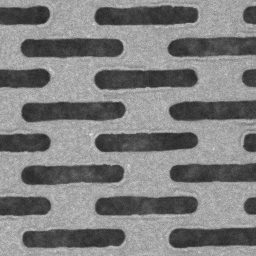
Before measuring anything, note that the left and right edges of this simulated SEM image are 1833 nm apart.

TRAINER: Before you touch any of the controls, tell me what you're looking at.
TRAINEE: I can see a regular array of holes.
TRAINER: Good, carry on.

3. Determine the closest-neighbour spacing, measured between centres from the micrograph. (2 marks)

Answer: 453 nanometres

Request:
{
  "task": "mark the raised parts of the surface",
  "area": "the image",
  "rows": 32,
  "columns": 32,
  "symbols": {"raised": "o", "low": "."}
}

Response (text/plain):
oooooooooooooooooooooooooooooooo
......oooooo.............ooooo..
......oooooo.............oooooo.
oooooooooooooooooooooooooooooooo
oooooooooooooooooooooooooooooooo
ooo............oooooo...........
ooo............oooooo...........
oooooooooooooooooooooooooooooooo
oooooooooooooooooooooooooooooooo
......oooooo.............ooooo..
......oooooo............ooooooo.
oooooooooooooooooooooooooooooooo
oooooooooooooooooooooooooooooooo
ooo.............ooooo...........
ooo............oooooo...........
oooooooooooooooooooooooooooooooo
oooooooooooooooooooooooooooooooo
......oooooo.............oooooo.
......oooooo............ooooooo.
oooooooooooooooooooooooooooooooo
ooooooooooooooooooooooo..o...oo.
ooo............oooooo...........
ooo............ooooooo..........
oooooooooooooooooooooooooooooooo
o.ooooooooooooooooooo..ooooooooo
......oooooo.............oooooo.
......oooooo............ooooooo.
oooooooooooooooooooooooooooooooo
oooooooooooooooooooooo.ooooo....
ooo.............ooooo...........
ooo............oooooo...........
oooooooooooooooooooooooooooooooo